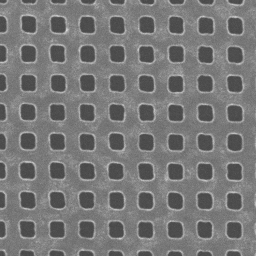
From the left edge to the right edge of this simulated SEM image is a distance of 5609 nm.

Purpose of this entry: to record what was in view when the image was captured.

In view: a regular array of holes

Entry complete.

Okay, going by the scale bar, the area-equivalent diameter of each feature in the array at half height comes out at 377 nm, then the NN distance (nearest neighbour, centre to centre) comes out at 635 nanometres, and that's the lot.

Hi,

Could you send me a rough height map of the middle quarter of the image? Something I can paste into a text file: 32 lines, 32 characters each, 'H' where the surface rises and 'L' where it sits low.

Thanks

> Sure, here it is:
HHHHHHHHHHHHHHHHHHHHHHHHHHHHHHHH
HHHHHHHHHHHHHHHHHHHHHHHHHHHHHHHH
HHHHHHHHHHHHHHHHHHHHHHHHHHHHHHHH
HHHHLLLLHHHLLLLHHHHLLLHHHHLLLLHH
LHHHLLLLHHHLLLLHHHHLLLLHHHLLLLHH
LHHHLLLLHHHLLLLHHHHLLLLHHHLLLLHH
HHHHHLLLHHHHLLLHHHHLLLHHHHLLLLHH
HHHHHHHHHHHHHHHHHHHHHHHHHHHHHHHH
HHHHHHHHHHHHHHHHHHHHHHHHHHHHHHHH
HHHHHHHHHHHHHHHHHHHHHHHHHHHHHHHH
HHHHLLLHHHHLLLLHHHHLLLHHHHLLLHHH
HHHHLLLLHHHLLLLHHHHLLLLHHHLLLLHH
HHHHLLLLHHHLLLLHHHHLLLLHHHLLLLHH
HHHHLLLLHHHLLLLHHHHLLLLHHHLLLLHH
HHHHHHHHHHHHHHHHHHHHHHHHHHHHLHHH
HHHHHHHHHHHHHHHHHHHHHHHHHHHHHHHH
HHHHHHHHHHHHHHHHHHHHHHHHHHHHHHHH
HHHHLLHHHHHHLLHHHHHHLHHHHHHLHHHH
HHHHLLLLHHHLLLLHHHHLLLHHHHLLLLHH
HHHHLLLLHHHLLLLHHHHLLLLHHHLLLLHH
HHHHLLLLHHHLLLLHHHHLLLLHHHLLLLHH
HHHHLLLHHHHHLLHHHHHLLLHHHHHLLHHH
HHHHHHHHHHHHHHHHHHHHHHHHHHHHHHHH
HHHHHHHHHHHHHHHHHHHHHHHHHHHHHHHH
HHHHHHHHHHHHHHHHHHHHHHHHHHHHHHHH
HHHHLLLLHHHLLLLHHHLLLLHHHHLLLLHH
HHHHLLLLHHHLLLLHHHLLLLHHHHLLLLHH
HHHHLLLLHHHLLLLHHHHLLLHHHHLLLLHH
HHHHLLLLHHHHLLLHHHHLLLHHHHLLLLHH
HHHHHHHHHHHHHHHHHHHHHHHHHHHHHHHH
HHHHHHHHHHHHHHHHHHHHHHHHHHHHHHHH
HHHHHHHHHHHHHHHHHHHHHHHHHHHHHHHH